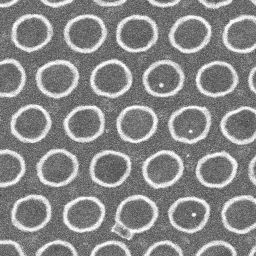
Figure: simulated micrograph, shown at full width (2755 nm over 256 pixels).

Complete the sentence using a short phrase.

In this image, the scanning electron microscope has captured a regular array of raised bodies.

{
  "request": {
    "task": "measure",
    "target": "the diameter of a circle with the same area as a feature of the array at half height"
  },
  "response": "390 nm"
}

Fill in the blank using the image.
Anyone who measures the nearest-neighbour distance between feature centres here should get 558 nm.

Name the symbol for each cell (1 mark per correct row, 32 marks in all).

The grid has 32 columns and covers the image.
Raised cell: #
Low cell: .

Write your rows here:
#.....##............##....##....
................................
...###...###....###....##.....##
..####..#####..####...####..####
..####..#####..####..#####..####
..###....###...####...###...####
................................
................................
##...####...####...###....###...
###..#####..####..#####..####..#
###..####...####..#####..####..#
##....##....###....###...###....
................................
...##.....##....##......#.......
..####...####..####...####..####
..####..#####..####..#####..####
..####...####..####...####..####
...#............##.....##....##.
................................
##....###...####...###....##....
###..#####..####..#####..####...
###..####..#####..#####..####..#
##...####...###...####...####...
................................
................................
..####...###...####...####...###
..####..#####..####..#####..####
..####..#####..####..#####..####
...##....###...###....###....##.
...............#................
##....##.....##.....#......#....
###..####...####...###...####...